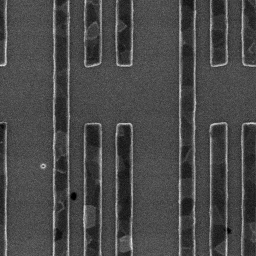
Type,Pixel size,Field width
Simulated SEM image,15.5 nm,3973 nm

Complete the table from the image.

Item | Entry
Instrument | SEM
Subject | wiring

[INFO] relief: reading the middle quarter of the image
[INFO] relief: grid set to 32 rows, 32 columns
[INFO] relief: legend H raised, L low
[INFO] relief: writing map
HLLLLLHLLLLLLLLLLLLLLLLLLLLLLHHH
HLLLLLLLLLLLLLLLLLLLLLLLLLLLLHHH
HLLLLLLLLLLLLLLLLLLLLLLLLLLLLHHH
HLLLLLLLLLLLLLLLLLLLLLLLLLLLLHHH
HLLLLLLLLLLLLLLLLLLLLLLLLLLLLHHH
HLLLLLLLLLLLLLLLLLLLLLLLLLLLLHHH
HLLLLLLLLLLLLLLLLLLLLLLLLLLLLHHH
HLLLLLLLLLLLLLLLLLLLLLLLLLLLLHHH
HLLLLLLLLLLLLLLLLLLLLLLLLLLLLHHH
HLLLLLLLLLLLLLLLLLLLLLLLLLLLLHHH
HLLLLLLLLLLLLLLLLLLLLLLLLLLLLHHH
HLLLLLLLLLLLLLLLLLLLLLLLLLLLLHHH
HLLLLLLLLLLLLLLLLLLLLLLLLLLLLHHH
HLLLLLLLLLLLLLLLLLLLLLLLLLLLLHHH
HLLLLLLLLLLLLLLLLLLLLLLLLLLLLHHH
HLLLLHHHHLLLLHHHHLLLLLLLLLLLLHHH
HLLLLHHHHLLLLHHHHLLLLLLLLLLLLHHH
HLLLLHHHHLLLLHHHHLLLLLLLLLLLLHHH
HLLLLHHHHLLLLHHHHLLLLLLLLLLLLHHH
HLLLLHHHHLLLLHHHHLLLLLLLLLLLLHHH
HLLLLHHHHLLLLHHHHLLLLLLLLLLLLHHH
HLLLLHHHHLLLLHHHHLLLLLLLLLLLLHHH
HLLLLHHHHLLLLHHHHLLLLLLLLLLLLHHH
HLLLLHHHHLLLLHHHHLLLLLLLLLLLLHHH
HLLLLHHHHLLLLHHHHLLLLLLLLLLLLHHH
HLLLLHHHHLLLLHHHHLLLLLLLLLLLLHHH
HLLLLHHHHLLLLHHHHLLLLLLLLLLLLHHH
HLLLLHHHHLLLLHHHHLLLLLLLLLLLLHHH
HLLLLHHHHLLLLHHHHLLLLLLLLLLLLHHH
HLLLLHHHHLLLLHHHHLLLLLLLLLLLLHHH
HLLLLHHHHLLLLHHHHLLLLLLLLLLLLHHH
HLLLLHHHHLLLLHHHHLLLLLLLLLLLLHHH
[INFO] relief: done